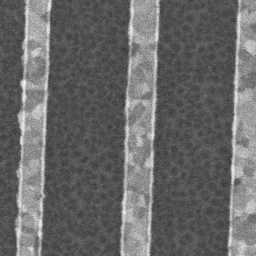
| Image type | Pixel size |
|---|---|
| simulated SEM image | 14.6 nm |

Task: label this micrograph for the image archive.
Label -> one or a few lines or trenches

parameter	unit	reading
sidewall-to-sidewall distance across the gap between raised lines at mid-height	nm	1200